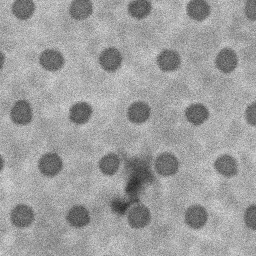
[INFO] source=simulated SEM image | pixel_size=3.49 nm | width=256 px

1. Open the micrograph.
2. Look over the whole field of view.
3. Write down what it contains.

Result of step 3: a regular array of holes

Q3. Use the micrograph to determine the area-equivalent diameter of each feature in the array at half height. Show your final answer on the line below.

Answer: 87.2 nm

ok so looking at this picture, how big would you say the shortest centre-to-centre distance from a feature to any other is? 57.8 px